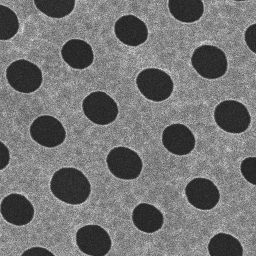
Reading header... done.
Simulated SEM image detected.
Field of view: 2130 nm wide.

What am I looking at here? a regular array of holes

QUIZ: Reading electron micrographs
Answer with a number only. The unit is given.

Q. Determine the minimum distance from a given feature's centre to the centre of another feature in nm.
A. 487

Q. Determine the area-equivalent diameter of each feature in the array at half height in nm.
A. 281